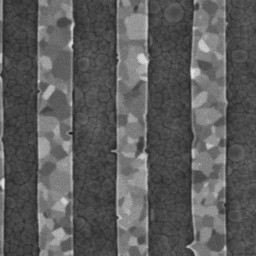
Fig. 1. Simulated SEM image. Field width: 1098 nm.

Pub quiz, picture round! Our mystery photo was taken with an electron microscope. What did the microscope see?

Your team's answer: one or a few lines or trenches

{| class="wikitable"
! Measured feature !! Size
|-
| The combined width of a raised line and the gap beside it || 0.33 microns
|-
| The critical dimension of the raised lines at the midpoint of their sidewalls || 0.138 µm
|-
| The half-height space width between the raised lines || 194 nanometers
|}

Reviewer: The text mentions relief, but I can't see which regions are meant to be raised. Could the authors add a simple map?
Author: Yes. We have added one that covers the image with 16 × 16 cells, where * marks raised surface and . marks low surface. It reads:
..**...**...**..
..***..**...**..
..**...**...**..
..**...**...**..
..**...**...**..
..**...**...**..
..**...**...**..
..**...**...**..
..**...**...**..
..**...**...**..
..**...**...**..
..***..**...**..
..***..**...**..
..***..**...**..
..***..**...**..
..***..**...**..